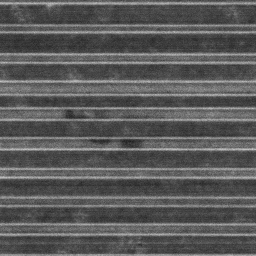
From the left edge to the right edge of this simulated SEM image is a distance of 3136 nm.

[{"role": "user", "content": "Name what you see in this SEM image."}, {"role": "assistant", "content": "parallel lines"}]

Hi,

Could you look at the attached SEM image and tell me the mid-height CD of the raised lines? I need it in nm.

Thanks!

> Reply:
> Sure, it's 242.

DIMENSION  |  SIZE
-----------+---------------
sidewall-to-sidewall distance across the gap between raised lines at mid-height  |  120 nanometers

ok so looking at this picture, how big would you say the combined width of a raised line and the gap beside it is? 353 nm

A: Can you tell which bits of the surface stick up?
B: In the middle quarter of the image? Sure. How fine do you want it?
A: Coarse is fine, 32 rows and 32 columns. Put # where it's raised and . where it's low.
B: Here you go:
################################
################################
################################
################################
................................
................................
................................
................................
################################
################################
################################
................................
................................
................................
################################
################################
################################
################################
################################
................................
................................
################################
################################
################################
################################
################################
................................
................................
........................####..##
################################
################################
################################